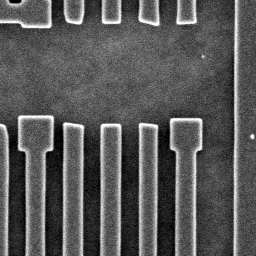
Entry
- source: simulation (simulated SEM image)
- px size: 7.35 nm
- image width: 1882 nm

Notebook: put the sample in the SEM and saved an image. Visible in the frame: wiring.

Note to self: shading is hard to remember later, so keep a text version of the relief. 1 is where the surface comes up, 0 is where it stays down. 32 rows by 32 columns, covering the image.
11111100110001100111001100000111
11111100110001100111001100000111
11111100110001100011001110000111
00000000000000000000000000000111
00000000000000000000000000000111
00000000000000000000000000000111
00000000000000000000000000000111
00000000000000000000000000000111
00000000000000000000000000000111
00000000000000000000000000000111
00000000000000000000000000000111
00000000000000000000000000000111
00000000000000000000000000000111
00000000000000000000000000000111
00000000000000000000000000000111
00111110100000000010011110000111
10111110110001100111011110000111
10111110110001100111011110000111
10111110110001100111011110000111
10011100110001100111001110000111
10011100110001100111001100000111
10011100110001100111001100000111
10011100110001100111001100000111
10011100110001100111001100000111
10011100110001100111001100000111
10011100110001100111001100000111
10011100110001100111001100000111
10011100110001100111001100000111
10011100110001100111001100000111
10011100110001100111001100000111
10011100110001100111001100000111
10011100110001100111001100000111